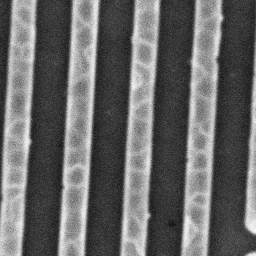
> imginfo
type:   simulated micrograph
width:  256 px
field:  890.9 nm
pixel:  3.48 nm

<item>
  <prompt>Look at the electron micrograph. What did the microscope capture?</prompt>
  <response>one or a few lines or trenches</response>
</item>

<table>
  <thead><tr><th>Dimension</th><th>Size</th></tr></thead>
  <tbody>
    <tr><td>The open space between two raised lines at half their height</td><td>131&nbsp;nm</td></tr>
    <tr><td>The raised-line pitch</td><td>0.213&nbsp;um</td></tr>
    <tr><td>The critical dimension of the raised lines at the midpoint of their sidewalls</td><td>83.7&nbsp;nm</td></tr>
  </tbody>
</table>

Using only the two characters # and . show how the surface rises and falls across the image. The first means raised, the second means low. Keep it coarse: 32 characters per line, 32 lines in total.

..##.....###.....###.....###....
..##.....###.....###.....###....
..##.....###.....###.....###....
.###.....###.....###....###.....
.###.....###.....###....###.....
.###.....###.....###....###.....
.###.....###.....##.....###.....
.###.....###.....##.....###.....
.###.....###.....##.....###.....
.###.....###....###.....###.....
.###.....###....###.....###.....
.###.....###....###.....###.....
.###.....###....###.....###.....
.###.....##.....###.....###.....
.###....###.....###.....###....#
.###....###.....###.....###.....
.###....###.....###.....###....#
.###....###.....###.....###....#
####....###.....###.....###....#
###.....###.....###.....##.....#
###.....###.....###.....##.....#
###.....###.....###....###.....#
###.....###.....###....###.....#
###.....###.....###....###.....#
###.....###.....##.....###.....#
###.....###.....##.....###.....#
###.....###.....###....###.....#
###.....###....###.....###.....#
###.....##.....###.....###.....#
###.....##.....###.....###......
###.....##.....###.....###......
###....###.....###.....###......